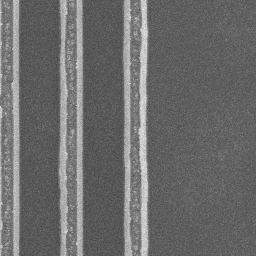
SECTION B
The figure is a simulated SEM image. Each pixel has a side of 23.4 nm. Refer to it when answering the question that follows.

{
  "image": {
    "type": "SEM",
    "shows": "one or a few lines or trenches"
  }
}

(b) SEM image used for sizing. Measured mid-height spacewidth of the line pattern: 1100 nanometres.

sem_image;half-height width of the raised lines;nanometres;388